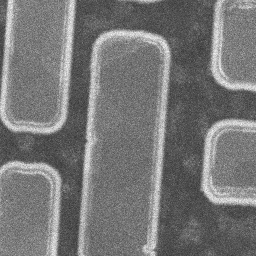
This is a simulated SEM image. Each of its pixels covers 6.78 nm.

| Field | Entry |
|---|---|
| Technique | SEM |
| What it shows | one or a few lines or trenches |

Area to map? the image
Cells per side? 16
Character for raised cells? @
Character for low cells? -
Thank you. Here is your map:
-@@@----------@@
-@@@----------@@
-@@@--@@@@----@@
@@@@--@@@@---@@@
@@@@--@@@@----@@
@@@@--@@@@------
@@@@--@@@@------
@@@@--@@@@------
------@@@@---@@@
------@@@@---@@@
@@@--@@@@@---@@@
@@@@-@@@@@---@@@
@@@@-@@@@@----@@
@@@@-@@@@@------
@@@--@@@@@------
@@@--@@@@@------